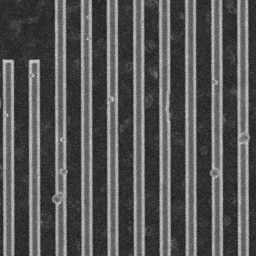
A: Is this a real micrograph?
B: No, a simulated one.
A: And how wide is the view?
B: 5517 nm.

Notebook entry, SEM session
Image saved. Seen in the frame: parallel lines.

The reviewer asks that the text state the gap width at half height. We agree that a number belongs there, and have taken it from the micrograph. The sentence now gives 388 nanometers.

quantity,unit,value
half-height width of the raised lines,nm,167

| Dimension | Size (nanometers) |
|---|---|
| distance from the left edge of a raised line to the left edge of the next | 562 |